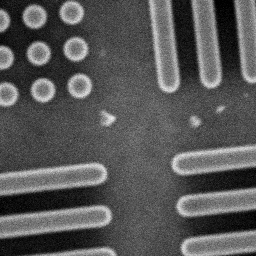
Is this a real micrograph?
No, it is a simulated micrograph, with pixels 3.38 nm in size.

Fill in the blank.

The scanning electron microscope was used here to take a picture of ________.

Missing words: groups of lines, slits or small figures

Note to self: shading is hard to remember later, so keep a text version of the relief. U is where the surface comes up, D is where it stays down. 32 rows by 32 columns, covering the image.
DDDDDDDDUUDDDDDDDDDUUDDDUUUDDUUU
UDDUUUDDUUDDDDDDDDDUUDDDUUUDDDUU
UDDUUUDDUUDDDDDDDDDUUUDDUUUDDDUU
UDDDDDDDDDDDDDDDDDDUUUDDUUUDDDUU
DDDDDDDDDDDDDDDDDDDUUUDDUUUDDDUU
DDDDUUDDUUUDDDDDDDDUUUDDDUUDDDUU
UDDUUUDDUUUDDDDDDDDUUUDDDUUDDDUU
UUDDUUDDDUDDDDDDDDDDUUDDDUUDDDUU
UDDDDDDDDDDDDDDDDDDDUUDDDUUDDDUU
DDDDDDDDDUUDDDDDDDDDUUDDDUUUDDDU
UDDDUUUDDUUDDDDDDDDDUUDDDDUDDDDD
UUDDUUUDDUUDDDDDDDDDDDDDDDDDDDDD
UUDDDUDDDDDDDDDDDDDDDDDDDDDDDDDD
DDDDDDDDDDDDDDDDDDDDDDDDDDDDDDDD
DDDDDDDDDDDDDDDDDDDDDDDDDDDDDDDD
DDDDDDDDDDDDDDDDDDDDDDDDDDDDDDDD
DDDDDDDDDDDDDDDDDDDDDDDDDDDDDDDD
DDDDDDDDDDDDDDDDDDDDDDDDDDDDDDDD
DDDDDDDDDDDDDDDDDDDDDDDDDDDDDDUU
DDDDDDDDDDDDDDDDDDDDDDUUUUUUUUUU
DDDDDDDDDDDDDDDDDDDDDDUUUUUUUUUU
DDDUUUUUUUUUUDDDDDDDDDUUUUDDDDDD
UUUUUUUUUUUUUDDDDDDDDDDDDDDDDDDD
UUUUUUUUDDDDDDDDDDDDDDDDDDDDDDDD
DDDDDDDDDDDDDDDDDDDDDDDUUUUUUUUU
DDDDDDDDDDDDDDDDDDDDDDUUUUUUUUUU
DDDDDUUUUUUUUUDDDDDDDDUUUUUUDDDD
UUUUUUUUUUUUUUDDDDDDDDDDDDDDDDDD
UUUUUUUUUUUDDDDDDDDDDDDDDDDDDDDD
UUDDDDDDDDDDDDDDDDDDDDDDDDUUUUUU
DDDDDDDDDDDDDDDDDDDDDDDUUUUUUUUU
DDDDDDDDUUUUUUDDDDDDDDDUUUUUUUUD